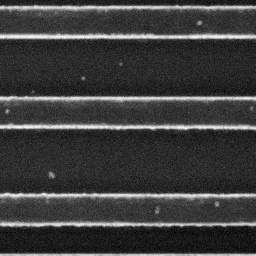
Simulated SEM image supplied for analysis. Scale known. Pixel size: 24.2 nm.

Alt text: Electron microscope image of lines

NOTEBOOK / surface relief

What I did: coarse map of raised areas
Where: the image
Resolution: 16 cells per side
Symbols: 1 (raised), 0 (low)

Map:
1111111111111111
1111111111111111
0000000000000000
0000000000000000
0000000000000000
0000000000000000
1111111111111111
1111111111111111
0000000000000000
0000000000000000
0000000000000000
0000000000000000
1111111111111111
1111111111111111
0000000000000000
0000000000000000